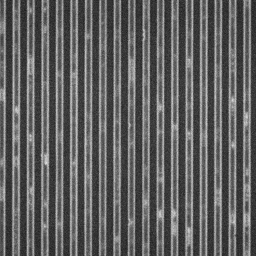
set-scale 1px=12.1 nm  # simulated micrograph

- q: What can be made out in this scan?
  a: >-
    parallel lines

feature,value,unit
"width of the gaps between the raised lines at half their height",98.6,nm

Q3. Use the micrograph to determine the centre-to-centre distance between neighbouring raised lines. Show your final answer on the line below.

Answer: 175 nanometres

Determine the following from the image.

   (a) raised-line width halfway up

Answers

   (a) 6.25 pixels